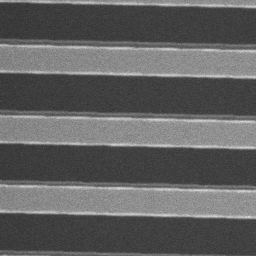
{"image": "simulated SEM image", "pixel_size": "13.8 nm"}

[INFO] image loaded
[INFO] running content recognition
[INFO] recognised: lines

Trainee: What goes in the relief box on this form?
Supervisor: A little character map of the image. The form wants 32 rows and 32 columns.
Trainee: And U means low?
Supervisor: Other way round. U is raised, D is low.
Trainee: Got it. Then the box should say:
DDDDDDDDDDDDDUUUUUUUUUUUUUUUUUUU
DDDDDDDDDDDDDDDDDDDDDDDDDDDDDDDD
DDDDDDDDDDDDDDDDDDDDDDDDDDDDDDDD
DDDDDDDDDDDDDDDDDDDDDDDDDDDDDDDD
DDDDDDDDDDDDDDDDDDDDDDDDDDDDDDDD
UUUUUUUUUUUUUUUUUUUUUUUDDDDDDDDD
UUUUUUUUUUUUUUUUUUUUUUUUUUUUUUUU
UUUUUUUUUUUUUUUUUUUUUUUUUUUUUUUU
UUUUUUUUUUUUUUUUUUUUUUUUUUUUUUUU
DDDDDDDDDDDDDDDDDDDDDDDUUUUUUUUU
DDDDDDDDDDDDDDDDDDDDDDDDDDDDDDDD
DDDDDDDDDDDDDDDDDDDDDDDDDDDDDDDD
DDDDDDDDDDDDDDDDDDDDDDDDDDDDDDDD
DDDDDDDDDDDDDDDDDDDDDDDDDDDDDDDD
UUUUUUUUUUUUUUUUUUUUUUUUUDDDDDDD
UUUUUUUUUUUUUUUUUUUUUUUUUUUUUUUU
UUUUUUUUUUUUUUUUUUUUUUUUUUUUUUUU
UUUUUUUUUUUUUUUUUUUUUUUUUUUUUUUU
DDDDDDDDDDDDDDDDDDDDDDDDDDDDUUUU
DDDDDDDDDDDDDDDDDDDDDDDDDDDDDDDD
DDDDDDDDDDDDDDDDDDDDDDDDDDDDDDDD
DDDDDDDDDDDDDDDDDDDDDDDDDDDDDDDD
DDDDDDDDDDDDDDDDDDDDDDDDDDDDDDDD
UUUUUUUUUUUUUUUUUUUUUUUUUUUUUUUU
UUUUUUUUUUUUUUUUUUUUUUUUUUUUUUUU
UUUUUUUUUUUUUUUUUUUUUUUUUUUUUUUU
DDDUUUUUUUUUUUUUUUUUUUUUUUUUUUUU
DDDDDDDDDDDDDDDDDDDDDDDDDDDDDDDD
DDDDDDDDDDDDDDDDDDDDDDDDDDDDDDDD
DDDDDDDDDDDDDDDDDDDDDDDDDDDDDDDD
DDDDDDDDDDDDDDDDDDDDDDDDDDDDDDDD
UUDUDDDDDDDDDDDDDDDDDDDDDDDDDDDD